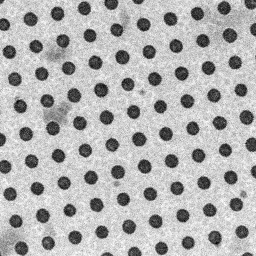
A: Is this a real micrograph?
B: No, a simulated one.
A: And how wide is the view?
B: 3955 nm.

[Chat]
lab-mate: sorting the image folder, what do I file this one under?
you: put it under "a regular array of holes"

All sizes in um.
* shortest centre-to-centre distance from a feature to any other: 0.422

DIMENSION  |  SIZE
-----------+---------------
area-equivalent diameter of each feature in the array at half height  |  14.4 px